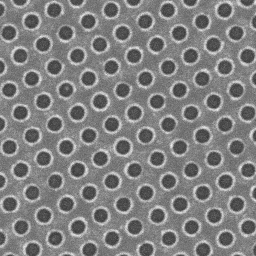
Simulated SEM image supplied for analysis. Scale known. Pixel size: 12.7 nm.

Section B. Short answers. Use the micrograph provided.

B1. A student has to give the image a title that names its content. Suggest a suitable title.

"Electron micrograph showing a regular array of holes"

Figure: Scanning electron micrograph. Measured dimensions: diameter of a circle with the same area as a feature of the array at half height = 190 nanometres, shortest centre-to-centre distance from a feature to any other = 0.322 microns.